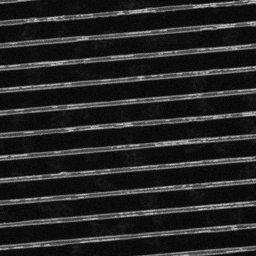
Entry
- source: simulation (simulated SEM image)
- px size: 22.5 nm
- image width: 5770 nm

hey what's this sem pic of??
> parallel lines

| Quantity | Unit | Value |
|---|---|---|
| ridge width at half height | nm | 101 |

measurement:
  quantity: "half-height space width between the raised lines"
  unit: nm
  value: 401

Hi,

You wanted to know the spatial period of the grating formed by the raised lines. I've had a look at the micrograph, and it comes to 22.4 pixels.